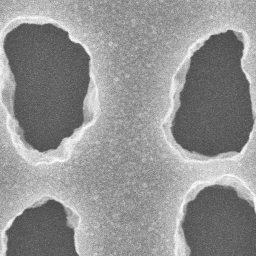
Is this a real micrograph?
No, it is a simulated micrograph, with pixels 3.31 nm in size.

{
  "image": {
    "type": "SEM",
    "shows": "holes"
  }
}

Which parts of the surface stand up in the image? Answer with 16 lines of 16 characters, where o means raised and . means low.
oooooooooooooooo
oo.ooooooooooooo
.....oooooooo..o
......oooooo...o
......oooooo...o
......ooooo.....
......ooooo.....
o.....ooooo.....
o...ooooooo.....
oo.ooooooooo...o
oooooooooooooooo
oooooooooooooo.o
oooooooooooo....
o....oooooo.....
.....oooooo.....
.....oooooo.....